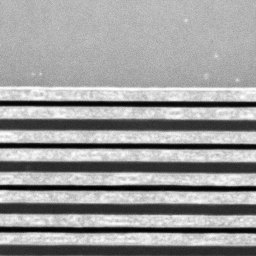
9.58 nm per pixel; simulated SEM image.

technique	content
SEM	parallel lines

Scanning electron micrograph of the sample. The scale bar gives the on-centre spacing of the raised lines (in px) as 20.6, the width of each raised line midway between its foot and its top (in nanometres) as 117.